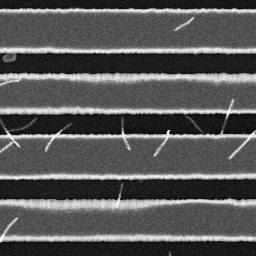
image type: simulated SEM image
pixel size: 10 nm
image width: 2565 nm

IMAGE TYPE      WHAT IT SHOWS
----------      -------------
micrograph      lines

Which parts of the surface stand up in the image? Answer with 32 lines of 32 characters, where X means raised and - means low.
--------------------------------
XXXXXXXXXXXXXXXXXXXXXXXXXXXXXXXX
XXXXXXXXXXXXXXXXXXXXXXXXXXXXXXXX
XXXXXXXXXXXXXXXXXXXXXXXXXXXXXXXX
XXXXXXXXXXXXXXXXXXXXXXXXXXXXXXXX
XXXXXXXXXXXXXXXXXXXXXXXXXXXXXXXX
-------X--XXXX-X-X----X-X---XX-X
--------------------------------
--------------------------------
XXXXXXXXXXXXXXXXXXXXXXXXXXXXXXXX
XXXXXXXXXXXXXXXXXXXXXXXXXXXXXXXX
XXXXXXXXXXXXXXXXXXXXXXXXXXXXXXXX
XXXXXXXXXXXXXXXXXXXXXXXXXXXXXXXX
XXXXXXXXXXXXXXXXXXXXXXXXXXXXXXXX
--------------------------------
--------------------------------
--------------------------------
XXXXXXXXXXXXXXXXXXXXXXXXXXXXXXXX
XXXXXXXXXXXXXXXXXXXXXXXXXXXXXXXX
XXXXXXXXXXXXXXXXXXXXXXXXXXXXXXXX
XXXXXXXXXXXXXXXXXXXXXXXXXXXXXXXX
XXXXXXXXXXXXXXXXXXXXXXXXXXXXXXXX
--------------------------------
--------------------------------
--------------------------------
XXXXXXXXXXXXXXXXXXXXXXXXXXXXXXXX
XXXXXXXXXXXXXXXXXXXXXXXXXXXXXXXX
XXXXXXXXXXXXXXXXXXXXXXXXXXXXXXXX
XXXXXXXXXXXXXXXXXXXXXXXXXXXXXXXX
XXXXXXXXXXXXXXXXXXXXXXXXXXXXXXXX
--------------------------------
--------------------------------